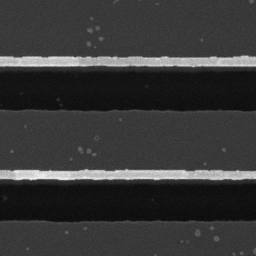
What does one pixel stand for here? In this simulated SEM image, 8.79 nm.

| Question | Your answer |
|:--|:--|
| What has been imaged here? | lines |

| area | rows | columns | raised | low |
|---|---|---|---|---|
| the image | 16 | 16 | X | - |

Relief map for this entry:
XXXXXXXXXXXXXXXX
XXXXXXXXXXXXXXXX
XXXXXXXXXXXXXXXX
XXXXXXXXXXXXXXXX
----------------
----------------
----------------
XXXXXXXXXXXXXXXX
XXXXXXXXXXXXXXXX
XXXXXXXXXXXXXXXX
XXXXXXXXXXXXXXXX
----------------
----------------
----------------
XXXXXXXXXXXXXXXX
XXXXXXXXXXXXXXXX